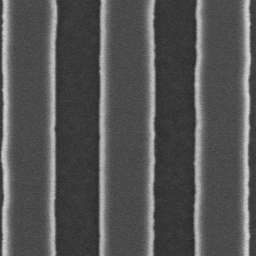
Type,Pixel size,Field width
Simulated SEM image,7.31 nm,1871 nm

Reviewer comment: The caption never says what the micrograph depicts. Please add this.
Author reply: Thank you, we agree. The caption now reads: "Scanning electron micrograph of lines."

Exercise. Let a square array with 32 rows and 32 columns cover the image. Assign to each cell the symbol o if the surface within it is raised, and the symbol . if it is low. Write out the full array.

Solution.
ooooooo......oooooo......oooooo.
ooooooo......oooooo......oooooo.
ooooooo......oooooo......oooooo.
ooooooo......oooooo......oooooo.
ooooooo......oooooo......oooooo.
ooooooo......oooooo......oooooo.
ooooooo......oooooo......oooooo.
ooooooo......oooooo......oooooo.
ooooooo......oooooo......oooooo.
ooooooo......oooooo.....ooooooo.
ooooooo......oooooo.....ooooooo.
ooooooo......oooooo.....ooooooo.
.oooooo......oooooo.....ooooooo.
ooooooo......oooooo.....ooooooo.
ooooooo......oooooo......oooooo.
ooooooo.....ooooooo......oooooo.
ooooooo......oooooo......oooooo.
ooooooo......oooooo......oooooo.
ooooooo......oooooo.....ooooooo.
ooooooo......oooooo.....ooooooo.
ooooooo......oooooo.....ooooooo.
ooooooo.....ooooooo.....ooooooo.
.oooooo......oooooo.....ooooooo.
.oooooo......oooooo......oooooo.
.oooooo......oooooo.....ooooooo.
ooooooo......oooooo.....ooooooo.
ooooooo.....ooooooo.....ooooooo.
ooooooo.....ooooooo.....ooooooo.
ooooooo......oooooo.....ooooooo.
ooooooo......oooooo.....ooooooo.
ooooooo.....ooooooo.....ooooooo.
ooooooo.....ooooooo......oooooo.